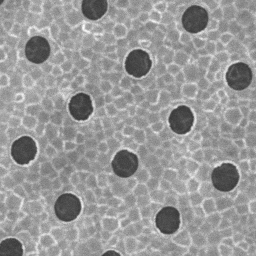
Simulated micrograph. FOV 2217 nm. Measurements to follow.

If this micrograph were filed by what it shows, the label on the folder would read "a regular array of holes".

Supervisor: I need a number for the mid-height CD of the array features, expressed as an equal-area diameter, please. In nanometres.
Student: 239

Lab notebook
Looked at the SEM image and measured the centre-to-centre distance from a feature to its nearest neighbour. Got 618 nm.